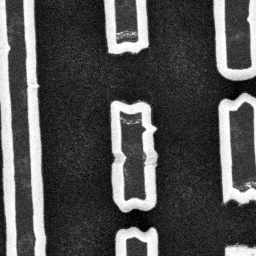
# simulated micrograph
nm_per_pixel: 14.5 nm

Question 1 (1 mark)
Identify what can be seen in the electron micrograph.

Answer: one or a few lines or trenches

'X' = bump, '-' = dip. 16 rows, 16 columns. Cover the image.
XX-----XX-----XX
XX-----XX-----XX
XX-----XX-----XX
XX------------XX
XX------------XX
XX--------------
XX------------XX
XX-----XX-----XX
XX-----XX-----XX
XX-----XX-----XX
XX-----XX-----XX
XX-----XX-----XX
-X------X-------
-X--------------
-XX-------------
-XX-----XX------